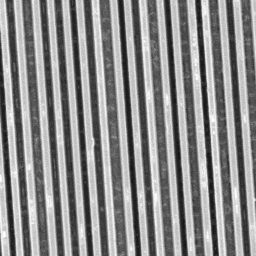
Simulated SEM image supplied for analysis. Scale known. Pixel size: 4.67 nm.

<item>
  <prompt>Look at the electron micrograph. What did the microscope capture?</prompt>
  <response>parallel lines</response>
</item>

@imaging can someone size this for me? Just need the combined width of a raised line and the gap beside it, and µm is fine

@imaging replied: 0.0728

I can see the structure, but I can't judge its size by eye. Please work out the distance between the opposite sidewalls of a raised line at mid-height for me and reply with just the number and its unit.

35.5 nm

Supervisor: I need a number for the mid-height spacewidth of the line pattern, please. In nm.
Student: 35.5